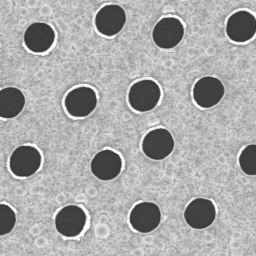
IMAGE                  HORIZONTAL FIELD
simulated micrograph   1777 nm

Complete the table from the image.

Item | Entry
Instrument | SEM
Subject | a regular array of holes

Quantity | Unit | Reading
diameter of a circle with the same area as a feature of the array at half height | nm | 218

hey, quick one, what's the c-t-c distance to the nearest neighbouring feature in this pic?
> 0.409 um